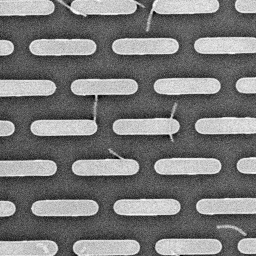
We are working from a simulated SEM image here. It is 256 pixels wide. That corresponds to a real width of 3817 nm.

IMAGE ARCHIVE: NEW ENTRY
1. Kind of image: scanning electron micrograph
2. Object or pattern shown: groups of lines, slits or small figures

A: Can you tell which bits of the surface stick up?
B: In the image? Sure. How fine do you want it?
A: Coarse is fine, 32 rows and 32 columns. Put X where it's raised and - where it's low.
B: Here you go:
XXXXXXX--XXXXXXXX--XXXXXXXX---XX
XXXXXX---XXXXXXXX---XXXXX-------
--------------------------------
--------------------------------
--------------------------------
X---XXXXXXXX--XXXXXXXX--XXXXXXXX
X---XXXXXXXX---XXXXXXX---XXXXXX-
--------------------------------
--------------------------------
--------------------------------
XXXXXXX--XXXXXXXX--XXXXXXXX---XX
XXXXXXX--XXXXXXXX---XXXXXXX---XX
--------------------------------
--------------------------------
--------------------------------
X---XXXXXXXX--XXXXXXXX---XXXXXXX
XX--XXXXXXXX---XXXXXXX---XXXXXXX
--------------------------------
--------------------------------
--------------------------------
XXXXXXX--XXXXXXXX---XXXXXXXX--XX
XXXXXXX--XXXXXXXX---XXXXXXX---XX
--------------------------------
--------------------------------
--------------------------------
XX--XXXXXXXX--XXXXXXXX---XXXXXXX
XX--XXXXXXXX---XXXXXXX---XXXXXXX
--------------------------------
--------------------------------
--------------------------------
XXXXXXX--XXXXXXXX---XXXXXXXX--XX
XXXXXXX--XXXXXXXX---XXXXXXX---XX